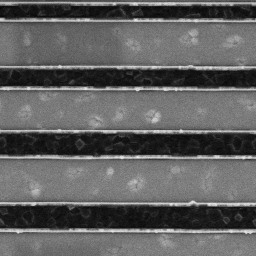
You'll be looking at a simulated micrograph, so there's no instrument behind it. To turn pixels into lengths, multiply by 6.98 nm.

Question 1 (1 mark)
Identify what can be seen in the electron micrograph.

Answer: one or a few lines or trenches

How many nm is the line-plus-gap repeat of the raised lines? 478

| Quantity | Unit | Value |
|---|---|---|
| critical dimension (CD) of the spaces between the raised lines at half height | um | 0.31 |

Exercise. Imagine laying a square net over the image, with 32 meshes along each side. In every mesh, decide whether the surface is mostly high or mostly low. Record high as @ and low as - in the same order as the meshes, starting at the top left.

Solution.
@@@@@@@@@@@@@@@@@@@@@@@@@@@@@@@@
@@@@@@@@@@@@@@@@@@@@@@@@@@@@@@@@
@@@@@@@@@@@@@@@@@@@@@@@@@@@@@@@@
--------------------------------
--------------------------------
--------------------------------
--------------------------------
--------------------------------
@@@@@@@@@@@@@@@@@@@@@@@@@@@@@@@@
@@@@@@@@@@@@@@@@@@@@@@@@@@@@@@@@
@@@@@@@@@@@@@@@@@@@@@@@@@@@@@@@@
--------------------------------
--------------------------------
--------------------------------
--------------------------------
--------------------------------
@@@@@@@@@@@@@@@@@@@@@@@@@@@@@@@@
@@@@@@@@@@@@@@@@@@@@@@@@@@@@@@@@
@@@@@@@@@@@@@@@@@@@@@@@@@@@@@@@@
@@@@@@@@@@@@@@@@@@@@@@@@@@@@@@@@
--------------------------------
--------------------------------
--------------------------------
--------------------------------
--------------------------------
@@@@@@@@@@@@@@@@@@@@@@@@@@@@@@@@
@@@@@@@@@@@@@@@@@@@@@@@@@@@@@@@@
@@@@@@@@@@@@@@@@@@@@@@@@@@@@@@@@
@@@@@@@@@@@@@@@@@@@@@@@@@@@@@@@@
--------------------------------
--------------------------------
--------------------------------